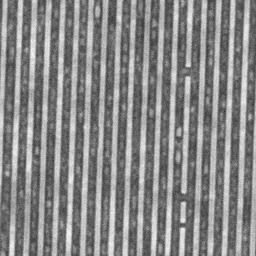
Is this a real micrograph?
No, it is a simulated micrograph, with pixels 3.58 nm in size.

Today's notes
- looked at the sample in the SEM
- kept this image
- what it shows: parallel lines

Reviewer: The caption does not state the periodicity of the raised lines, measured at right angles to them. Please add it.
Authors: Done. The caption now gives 50.7 nm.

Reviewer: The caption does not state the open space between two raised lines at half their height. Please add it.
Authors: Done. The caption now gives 33.1 nm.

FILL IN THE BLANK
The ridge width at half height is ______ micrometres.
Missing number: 0.0165